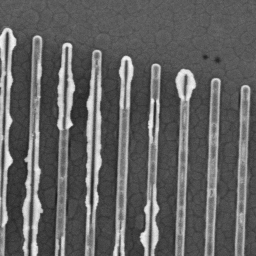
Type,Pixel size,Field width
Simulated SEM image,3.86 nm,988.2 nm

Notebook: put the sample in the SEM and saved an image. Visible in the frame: parallel lines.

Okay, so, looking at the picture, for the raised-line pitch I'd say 29.9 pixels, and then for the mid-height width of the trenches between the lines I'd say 79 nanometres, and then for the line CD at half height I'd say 0.0308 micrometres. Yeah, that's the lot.